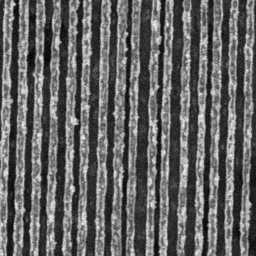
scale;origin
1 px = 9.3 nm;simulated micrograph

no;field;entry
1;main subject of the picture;parallel lines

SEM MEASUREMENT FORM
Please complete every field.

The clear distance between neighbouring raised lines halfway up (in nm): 82.5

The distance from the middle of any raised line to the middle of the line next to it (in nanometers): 150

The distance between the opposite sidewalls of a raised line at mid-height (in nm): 63.9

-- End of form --